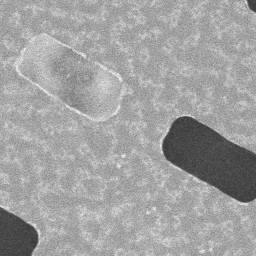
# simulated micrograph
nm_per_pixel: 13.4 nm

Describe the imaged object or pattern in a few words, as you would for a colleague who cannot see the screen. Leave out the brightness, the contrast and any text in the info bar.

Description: holes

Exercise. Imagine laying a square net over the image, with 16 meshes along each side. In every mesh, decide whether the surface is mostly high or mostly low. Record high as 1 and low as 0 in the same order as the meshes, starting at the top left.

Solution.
1111111111111111
1111111111111111
1111111111111111
1111111111111111
1111111111111111
1111111111111111
1111111111111111
1111111111101111
1111111111000011
1111111111000000
1111111111100000
1111111111111000
1111111111111110
0111111111111111
0011111111111111
0011111111111111